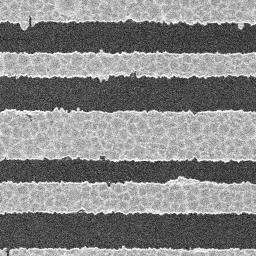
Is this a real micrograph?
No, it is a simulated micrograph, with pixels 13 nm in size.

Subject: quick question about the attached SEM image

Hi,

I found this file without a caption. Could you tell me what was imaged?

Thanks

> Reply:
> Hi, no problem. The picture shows one or a few lines or trenches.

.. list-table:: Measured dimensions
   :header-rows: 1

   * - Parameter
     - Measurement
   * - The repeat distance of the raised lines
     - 65.5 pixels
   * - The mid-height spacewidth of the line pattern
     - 435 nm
